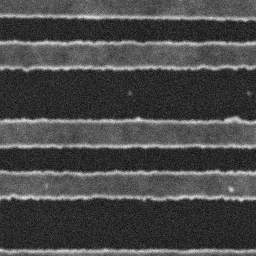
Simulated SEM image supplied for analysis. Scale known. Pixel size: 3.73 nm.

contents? lines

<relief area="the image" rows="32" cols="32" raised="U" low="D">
UUUUUUUUUUUUUUUUUUUUUUUUUUUUUUUU
UUUUUUUUUUUUUUUUUUUUUUUUUUUUUUUU
DDDDDDDDDDDDDDDDDDDDDDDDDDDDDDUD
DDDDDDDDDDDDDDDDDDDDDDDDDDDDDDDD
DDDDDDDDDDDDDDDDDDDDDDDDDDDDDDDD
UUUUUUUUUUUUUUUUUUUUUUUUUUUUUUUU
UUUUUUUUUUUUUUUUUUUUUUUUUUUUUUUU
UUUUUUUUUUUUUUUUUUUUUUUUUUUUUUUU
UUUUUUUUUUUUUUUUUUUUUUUUUDUUDUDU
DDDDDDDDDDDDDDDDDDDDDDDDDDDDDDDD
DDDDDDDDDDDDDDDDDDDDDDDDDDDDDDDD
DDDDDDDDDDDDDDDDDDDDDDDDDDDDDDDD
DDDDDDDDDDDDDDDDDDDDDDDDDDDDDDDD
DDDDDDDDDDDDDDDDDDDDDDDDDDDDDDDD
DDDDDDDDDDDDDDDDDDDDDDDDDDDDDDDD
UUUUUUUUUUUUUUUUUUUUUUUUUUUUUUUU
UUUUUUUUUUUUUUUUUUUUUUUUUUUUUUUU
UUUUUUUUUUUUUUUUUUUUUUUUUUUUUUUU
DDDDDDDDDDDDDDDUDDDDDDDDDDDDDDDU
DDDDDDDDDDDDDDDDDDDDDDDDDDDDDDDD
DDDDDDDDDDDDDDDDDDDDDDDDDDDDDDDD
UDDDUUUDUDDDDDUUUUDUUUDUDDUUUUUU
UUUUUUUUUUUUUUUUUUUUUUUUUUUUUUUU
UUUUUUUUUUUUUUUUUUUUUUUUUUUUUUUU
UUUUUUUUUUUUUUUUUUUUUUUUUUUUUUUU
DDDDDDDDDDDDDDDDDDDDDDDDDDDDDDDD
DDDDDDDDDDDDDDDDDDDDDDDDDDDDDDDD
DDDDDDDDDDDDDDDDDDDDDDDDDDDDDDDD
DDDDDDDDDDDDDDDDDDDDDDDDDDDDDDDD
DDDDDDDDDDDDDDDDDDDDDDDDDDDDDDDD
DDDDDDDDDDDDDDDDDDDDDDDDDDDDDDDD
UUUUUUUUUUUUUUUUUUUUUUUUUUUUUUUU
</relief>